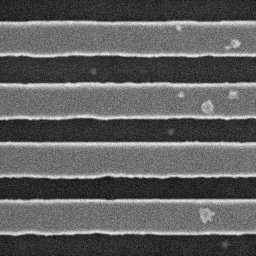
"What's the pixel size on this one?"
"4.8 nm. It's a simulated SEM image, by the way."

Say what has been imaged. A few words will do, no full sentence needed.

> lines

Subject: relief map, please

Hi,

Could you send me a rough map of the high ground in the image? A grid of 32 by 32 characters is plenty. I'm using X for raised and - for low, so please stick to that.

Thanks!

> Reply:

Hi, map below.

--------------------------------
--------------------------------
--------------------------------
XXXXXXXXXXXXXXXXXXXXXXXXXXXXXXXX
XXXXXXXXXXXXXXXXXXXXXXXXXXXXXXXX
XXXXXXXXXXXXXXXXXXXXXXXXXXXXXXXX
XXXXXXXXXXXXXXXXXXXXXXXXXXXXXXXX
--------------------------------
--------------------------------
--------------------------------
XXXXXXXXXXXXXXXXXXXXXXXXXXXXXXXX
XXXXXXXXXXXXXXXXXXXXXXXXXXXXXXXX
XXXXXXXXXXXXXXXXXXXXXXXXXXXXXXXX
XXXXXXXXXXXXXXXXXXXXXXXXXXXXXXXX
XXXXXXXXXXXXXXXXXXXXXXXXXXXXXXXX
--------------------------------
--------------------------------
--------------------------------
XXXXXXXXXXXXXXXXXXXXXXXXXXXXXXXX
XXXXXXXXXXXXXXXXXXXXXXXXXXXXXXXX
XXXXXXXXXXXXXXXXXXXXXXXXXXXXXXXX
XXXXXXXXXXXXXXXXXXXXXXXXXXXXXXXX
--------------------------------
--------------------------------
--------------------------------
XXXXXXXXXXXXXXXXXXXXXXXXXXXXXXXX
XXXXXXXXXXXXXXXXXXXXXXXXXXXXXXXX
XXXXXXXXXXXXXXXXXXXXXXXXXXXXXXXX
XXXXXXXXXXXXXXXXXXXXXXXXXXXXXXXX
--------------------------------
--------------------------------
--------------------------------